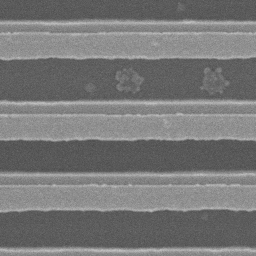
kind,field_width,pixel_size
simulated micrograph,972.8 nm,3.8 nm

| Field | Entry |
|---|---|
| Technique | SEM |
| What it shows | lines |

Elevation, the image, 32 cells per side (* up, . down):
................................
................................
................................
********************************
********************************
********************************
********************************
................................
................................
................................
................................
................................
................................
********************************
********************************
********************************
********************************
......***.......................
................................
................................
................................
................................
********************************
********************************
********************************
********************************
................................
................................
................................
................................
................................
********************************